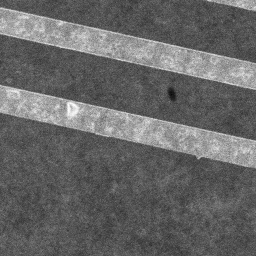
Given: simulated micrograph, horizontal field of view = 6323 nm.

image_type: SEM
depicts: one or a few lines or trenches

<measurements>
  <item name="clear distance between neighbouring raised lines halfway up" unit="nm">1270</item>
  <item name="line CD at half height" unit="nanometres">606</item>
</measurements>